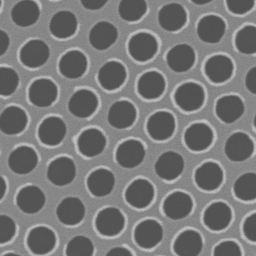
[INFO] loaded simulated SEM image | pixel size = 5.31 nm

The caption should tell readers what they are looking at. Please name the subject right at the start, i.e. a regular array of holes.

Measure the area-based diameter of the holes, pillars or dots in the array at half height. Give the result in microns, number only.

0.149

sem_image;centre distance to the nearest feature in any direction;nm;213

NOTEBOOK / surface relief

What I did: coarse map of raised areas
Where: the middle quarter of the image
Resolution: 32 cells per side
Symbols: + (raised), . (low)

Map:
......++++.....+++++++++++......
.....++++......++++++++++++....+
.....++++.......++++....++++++++
+..+++++.......++++......+++++++
+++++++++......++++......+++++++
+++++++++.....++++.......++++...
++++..+++++.++++++.......+++....
++.....++++++++++++.....++++....
++......++++++++++++...+++++....
+.......+++++...++++++++++++....
+.......++++.....++++++++++++...
+.......+++.......++++++++++++..
++.....++++.......+++++....+++++
+++++++++++.......+++......+++++
+++++++++++......++++.......++++
++++++++++++.....++++.......++++
.+++++...++++++++++++.......+++.
++++......+++++++++++......+++..
++++......++++++++++++....++++..
+++........++++....+++++++++++..
++++......++++......+++++++++++.
++++......+++.......++++++++++++
+++++....++++.......+++++....+++
.++++++++++++.......++++......++
..+++++++++++......++++.......++
...+++++++++++....+++++.......++
...+++++...++++++++++++.......++
...++++.....+++++++++++......+++
...+++.......+++++++++++....++++
..++++.......++++....+++++++++++
++++++......++++......++++++++++
++++++......++++.......+++++++++